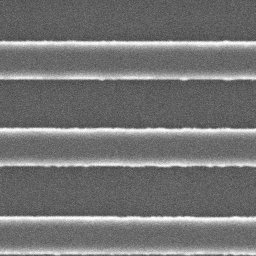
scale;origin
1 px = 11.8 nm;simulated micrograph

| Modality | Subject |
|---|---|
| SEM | lines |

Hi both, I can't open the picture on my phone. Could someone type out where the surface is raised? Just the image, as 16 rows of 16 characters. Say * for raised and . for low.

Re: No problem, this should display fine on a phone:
................
................
................
****************
****************
................
................
................
****************
****************
................
................
................
................
****************
****************